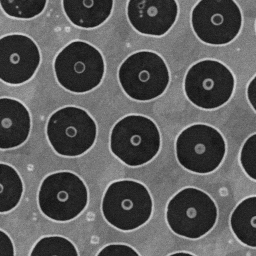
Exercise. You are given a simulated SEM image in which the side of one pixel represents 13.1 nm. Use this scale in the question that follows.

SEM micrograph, an array of small figures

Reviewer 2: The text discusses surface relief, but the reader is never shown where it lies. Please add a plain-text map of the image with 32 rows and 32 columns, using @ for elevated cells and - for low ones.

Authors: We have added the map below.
------@@------@@------@@@-----@@
@----@@@------@@------@@------@@
@@@@@@@@@----@@@------@@---@--@@
@@@@@@@@@@--@@@@@----@@@------@@
@--@@@@@@@@@@@@@@@@-@@@@@-----@@
----@@@@@--@@@@@@@@@@@@@@@--@@@@
-----@@------@@@@--@@@@@@@@@@@@@
-----@@------@@@----@@@@@--@@@@@
-----@@--@---@@------@@@----@@@@
----@@@------@@--@@--@@------@@@
@--@@@@-----@@@------@@------@@-
@@@@@@@@@--@@@@@-----@@------@@-
--@@@@@@@@@@@@@@@--@@@@@-----@@-
---@@@@@--@@@@@@@@@@@@@@@--@@@@@
----@@-----@@@@@--@@@@@@@@@@@@@@
----@@------@@-----@@@@@--@@@@@@
----@@--@---@@------@@@----@@@@@
---@@@------@@------@@------@@@-
--@@@@@----@@@------@@------@@--
@@@@@@@@--@@@@-----@@@------@@--
-@@@@@@@@@@@@@@@--@@@@@-----@@--
--@@@@@--@@@@@@@@@@@@@@@--@@@@@-
---@@-----@@@@@--@@@@@@@@@@@@@@@
---@@------@@-----@@@@@-@@@@@@@@
---@@--@---@@------@@@----@@@@@@
--@@@------@@------@@------@@@--
-@@@@-----@@@------@@------@@---
@@@@@@@--@@@@------@@------@@---
@@@@@@@@@@@@@@@--@@@@------@@---
-@@@@@-@@@@@@@@@@@@@@@@--@@@@---
--@@-----@@@@@-@@@@@@@@@@@@@@@--
--@@------@@-----@@@@@-@@@@@@@@@